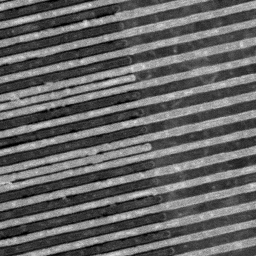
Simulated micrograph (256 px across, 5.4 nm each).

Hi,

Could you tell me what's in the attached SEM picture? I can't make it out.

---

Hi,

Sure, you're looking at parallel lines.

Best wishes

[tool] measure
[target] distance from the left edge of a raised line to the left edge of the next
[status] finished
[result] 48 nanometres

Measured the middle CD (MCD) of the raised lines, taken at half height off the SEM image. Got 34.9 nanometres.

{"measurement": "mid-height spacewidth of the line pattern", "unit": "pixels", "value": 1.81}